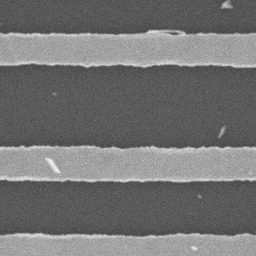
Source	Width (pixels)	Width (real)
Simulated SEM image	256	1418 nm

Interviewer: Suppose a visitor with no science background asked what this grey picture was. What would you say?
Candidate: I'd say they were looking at lines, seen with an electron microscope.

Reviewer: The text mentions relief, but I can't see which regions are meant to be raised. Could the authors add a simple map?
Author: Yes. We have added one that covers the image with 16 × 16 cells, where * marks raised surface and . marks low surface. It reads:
................
................
****************
****************
................
................
................
................
................
****************
****************
................
................
................
................
****************